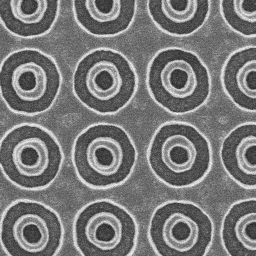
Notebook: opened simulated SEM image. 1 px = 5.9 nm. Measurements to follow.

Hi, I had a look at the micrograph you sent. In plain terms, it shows ring-shaped grooves with a dot in the middle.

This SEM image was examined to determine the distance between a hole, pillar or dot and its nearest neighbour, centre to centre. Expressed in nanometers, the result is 432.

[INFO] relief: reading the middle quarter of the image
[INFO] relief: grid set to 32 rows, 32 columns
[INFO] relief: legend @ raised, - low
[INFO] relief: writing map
@@@-----@@@@@----@@@@-----@@@@@-
@@@----@@@-@@----@@@@----@@---@@
@@@---@@----@@----@@@---@@@----@
@@----@@----@@----@@@---@@-----@
@@----@@-----@----@@@----@-----@
@@----@@----@@----@@@----@@---@@
@@@---@@@--@@@----@@@-----@@@@@@
@@@----@@@@@@----@@@@@-----@@@@-
@@@@----@@@------@@@@@----------
@@@@@-----------@@@@@@@---------
@@@@@@---------@@@@@@@@@@-------
@@@@@@@-------@@@@@@@@@@@@------
@@@@@@@@@@@@@@@@@@@@@@@@@@@@@@@@
@@@@@@@@@@@@@@@@@@@@@@@@@@@@@@@@
@@@@@@@@@@@@@@@@@@@@@@@@@@@@@@@@
@@@@@@@------@@@@@@@@@@@@-------
@@@@@@---------@@@@@@@@@--------
@@@@------------@@@@@@@---------
@@@-------------@@@@@@----@@@@@-
@@@----@@@@@@----@@@@@---@@@@@@-
@@@----@@@@@@@---@@@@@---@@@-@@@
@@----@@---@@@----@@@----@@----@
@@----@-----@@----@@@----@-----@
@@----@@-----@----@@@----@@----@
@@@---@@----@@----@@@----@@----@
@@@----@@--@@@---@@@@@----@@@@@@
@@@-----@@@@@----@@@@@-----@@@@-
@@@@------------@@@@@@@---------
@@@@-----------@@@@@@@@@--------
@@@@@---------@@@@@@@@@@@-------
@@@@@@@----@@@@@@@@@@@@@@@@---@@
@@@@@@@@@@@@@@@@@@@@@@@@@@@@@@@@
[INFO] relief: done